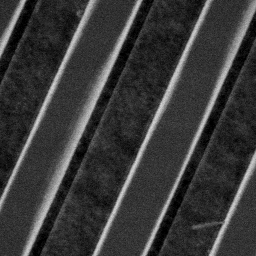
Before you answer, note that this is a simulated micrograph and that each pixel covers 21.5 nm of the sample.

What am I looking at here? lines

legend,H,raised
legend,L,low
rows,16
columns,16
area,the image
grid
HLLLLHHHHLLLLHHH
HLLLLHHHLLLLHHHH
LLLLLHHHLLLLHHHL
LLLLHHHLLLLHHHHL
LLLLHHHLLLLHHHLL
LLLHHHLLLLLHHHLL
LLLHHHLLLLHHHLLL
LLHHHLLLLLHHHLLL
LLHHHLLLLHHHLLLL
LHHHHLLLLHHHLLLL
LHHHLLLLHHHHLLLL
HHHHLLLLHHHLLLLH
HHHLLLLHHHHLLLLH
HHHLLLLHHHLLLLHH
HHLLLLHHHHLLLLHH
HHLLLLHHHLLLLHHH